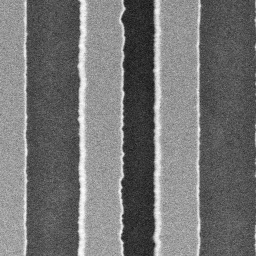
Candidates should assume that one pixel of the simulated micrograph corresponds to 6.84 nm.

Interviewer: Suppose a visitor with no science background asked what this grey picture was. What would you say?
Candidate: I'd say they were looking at lines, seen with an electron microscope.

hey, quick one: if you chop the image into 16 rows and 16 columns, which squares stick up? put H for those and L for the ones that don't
HHLLLHHHLLHHHLLL
HHLLLHHHLLHHLLLL
HHLLLHHHLLHHLLLL
HHLLLHHHLLHHLLLL
HHLLLHHHLLHHLLLL
HHLLLHHHLLHHLLLL
HHLLLHHHLLHHLLLL
HHLLLHHHLLHHLLLL
HHLLLHHHLLHHLLLL
HHLLLHHHLLHHLLLL
HHLLLHHHLLHHLLLL
HHLLLHHHLLHHLLLL
HHLLLHHHLLHHLLLL
HHLLLHHHLLHHLLLL
HHLLLHHHLLHHLLLL
HHLLLHHHLLHHLLLL